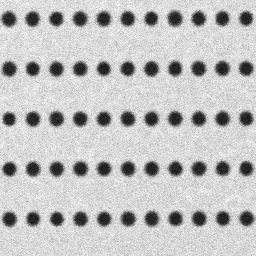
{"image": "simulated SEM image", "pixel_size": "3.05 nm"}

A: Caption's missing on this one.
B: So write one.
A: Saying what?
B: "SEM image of a regular array of holes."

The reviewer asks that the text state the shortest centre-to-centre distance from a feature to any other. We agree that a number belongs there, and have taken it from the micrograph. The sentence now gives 0.0712 um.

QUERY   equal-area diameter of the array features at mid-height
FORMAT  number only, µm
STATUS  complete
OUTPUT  0.0417